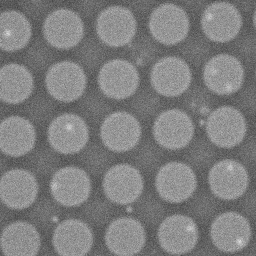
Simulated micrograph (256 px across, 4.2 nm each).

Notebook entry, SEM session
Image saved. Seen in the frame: an array of small figures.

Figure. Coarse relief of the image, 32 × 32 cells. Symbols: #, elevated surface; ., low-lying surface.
...........................#....
.#.....##....###...####...####..
###...####..#####..####..#####..
####..####..#####..####..#####..
####..####...####..####...###...
###...###.....#.................
................................
....................###...###...
###....###...####..####...####..
####..####..#####..#####..####..
####..#####..####..#####..####..
####..####...####...###....##...
###.....#.......................
................................
........#.....##....###...####..
####..#####..####..#####..#####.
####..#####..####..#####..#####.
####..#####..####...####...###..
####...###....##.....#..........
................................
.....................##....###..
.##....###....###...####..#####.
####...####..#####..####..#####.
#####.#####..#####..####..#####.
####...####...###...####...###..
.###....##......................
................................
...............##....###...####.
.###...####...####..####...####.
#####..####..#####..#####.#####.
#####..####..#####..####...####.
.####..####...###....##.........